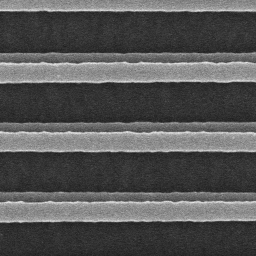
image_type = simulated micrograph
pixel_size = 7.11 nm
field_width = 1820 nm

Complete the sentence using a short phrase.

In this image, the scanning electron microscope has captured lines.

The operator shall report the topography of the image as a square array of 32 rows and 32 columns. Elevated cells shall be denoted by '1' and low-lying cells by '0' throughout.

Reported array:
11111111111111111111111111111111
00000000000000000000000000000000
00000000000000000000000000000000
00000000000000000000000000000000
00000000000000000000000000000000
00000000000000000000000000000000
00000000000000000000000000000000
11111111111111111111111111111111
11111111111111111111111111111111
11111111111111111111111111111111
00000000000000000000000000000000
00000000000000000000000000000000
00000000000000000000000000000000
00000000000000000000000000000000
00000000000000000000000000000000
11111111111111111111111111111111
11111111111111111111111111111111
11111111111111111111111111111111
11111111111111111111111111111111
00000000000000000000000000000000
00000000000000000000000000000000
00000000000000000000000000000000
00000000000000000000000000000000
00000000000000000000000000000000
11111111111111111111111111111111
11111111111111111111111111111111
11111111111111111111111111111111
11111111111111111111111111111111
00000000000000000000000000000000
00000000000000000000000000000000
00000000000000000000000000000000
00000000000000000000000000000000